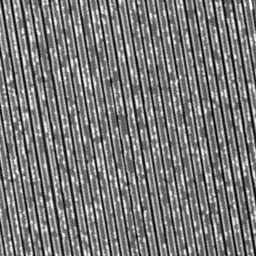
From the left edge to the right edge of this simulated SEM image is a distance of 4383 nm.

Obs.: parallel lines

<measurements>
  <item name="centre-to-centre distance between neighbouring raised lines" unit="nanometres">162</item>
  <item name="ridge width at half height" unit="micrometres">0.114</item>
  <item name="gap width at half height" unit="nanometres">48.5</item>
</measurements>